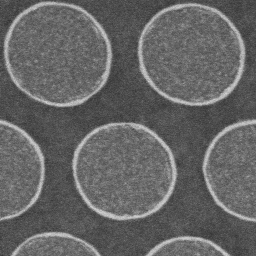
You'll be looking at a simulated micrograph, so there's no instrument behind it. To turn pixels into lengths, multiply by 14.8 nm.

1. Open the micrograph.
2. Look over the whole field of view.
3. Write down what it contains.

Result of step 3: raised bodies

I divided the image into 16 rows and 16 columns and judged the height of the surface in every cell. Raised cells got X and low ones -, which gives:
--XXX------XX---
-XXXXX---XXXXX--
XXXXXXX--XXXXXX-
XXXXXXX--XXXXXX-
-XXXXXX--XXXXXX-
-XXXXX----XXXX--
---X------------
----------------
XX----XXXX----XX
XX---XXXXXX--XXX
XXX--XXXXXX--XXX
XXX--XXXXXX--XXX
XX---XXXXX----XX
X------XX------X
----------------
-XXXXX----XXXX--